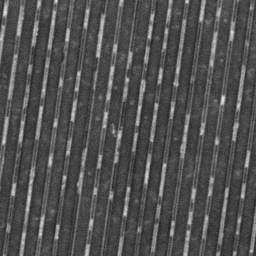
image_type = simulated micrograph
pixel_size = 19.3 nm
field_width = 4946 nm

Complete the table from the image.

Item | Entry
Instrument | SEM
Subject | parallel lines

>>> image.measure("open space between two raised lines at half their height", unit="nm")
258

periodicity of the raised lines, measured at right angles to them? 314 nanometres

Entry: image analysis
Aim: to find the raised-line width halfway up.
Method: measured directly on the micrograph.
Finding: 52.7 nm